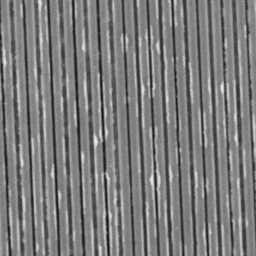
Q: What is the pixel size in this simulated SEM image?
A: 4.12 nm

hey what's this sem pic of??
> parallel lines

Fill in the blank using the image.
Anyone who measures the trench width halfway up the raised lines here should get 11.3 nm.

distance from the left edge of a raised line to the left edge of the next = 0.0512 microns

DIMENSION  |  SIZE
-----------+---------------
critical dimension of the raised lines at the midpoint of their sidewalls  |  36.6 nanometers